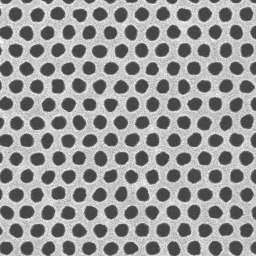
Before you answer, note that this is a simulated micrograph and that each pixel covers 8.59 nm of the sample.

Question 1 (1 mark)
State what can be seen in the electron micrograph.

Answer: a regular array of holes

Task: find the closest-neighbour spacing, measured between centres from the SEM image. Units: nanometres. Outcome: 173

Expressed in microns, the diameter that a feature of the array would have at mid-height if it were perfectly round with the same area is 0.12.